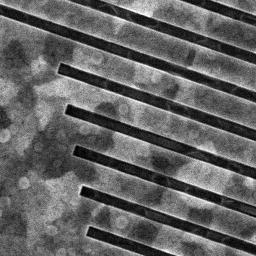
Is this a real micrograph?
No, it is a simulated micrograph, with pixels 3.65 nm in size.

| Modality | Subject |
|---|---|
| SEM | parallel lines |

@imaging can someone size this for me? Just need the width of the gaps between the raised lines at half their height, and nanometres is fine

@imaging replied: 42.4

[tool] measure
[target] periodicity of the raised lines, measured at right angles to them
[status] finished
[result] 132 nanometers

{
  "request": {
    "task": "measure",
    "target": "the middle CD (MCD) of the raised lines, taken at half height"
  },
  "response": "0.0906 um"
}